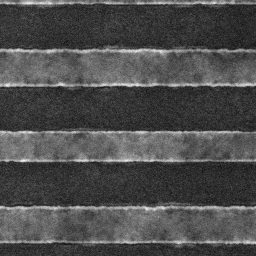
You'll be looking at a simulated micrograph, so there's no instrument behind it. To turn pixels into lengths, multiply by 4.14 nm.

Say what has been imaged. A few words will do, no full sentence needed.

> lines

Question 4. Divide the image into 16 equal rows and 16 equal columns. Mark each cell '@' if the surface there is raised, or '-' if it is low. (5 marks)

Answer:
----------------
----------------
----------------
@@@@@@@@@@@@@@@@
@@@@@@@@@@@@@@@@
----------------
----------------
----------------
@@@@@@@@@@@@@@@@
@@@@@@@@@@@@@@@@
----------------
----------------
----------------
@@@@@@@@@@@@@@@@
@@@@@@@@@@@@@@@@
----------------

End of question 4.